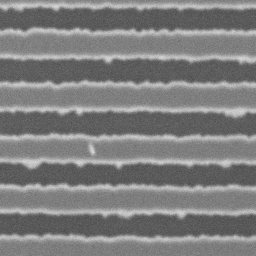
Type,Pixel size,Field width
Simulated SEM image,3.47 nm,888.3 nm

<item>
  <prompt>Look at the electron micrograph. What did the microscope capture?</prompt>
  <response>lines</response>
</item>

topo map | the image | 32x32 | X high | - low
XXXXXXXXXXXXXXXXXXXXXXXXXXXXXXXX
--------------------------------
--------------------------------
--------------------------------
XXXXXXXXXXXXXXXXXXXXXXXXXXXXXXXX
XXXXXXXXXXXXXXXXXXXXXXXXXXXXXXXX
XXXXXXXXXXXXXXXXXXXXXXXXXXXXXXXX
--------------------------------
--------------------------------
--------------------------------
XXXXXXX-XXXXXXXXX-XXXXXXXXXXXXXX
XXXXXXXXXXXXXXXXXXXXXXXXXXXXXXXX
XXXXXXXXXXXXXXXXXXXXXXXXXXXXXXXX
XXXXXXXXXXXXXXXXXXXXXXXXXXXXXXXX
--------------------------------
--------------------------------
--------------------------------
XXXXXXXXXXXXXXXXXXXXXXXXXXXXXXXX
XXXXXXXXXXXXXXXXXXXXXXXXXXXXXXXX
XXXXXXXXXXXXXXXXXXXXXXXXXXXXXXXX
-------------XXX---------X-X---X
--------------------------------
--------------------------------
XXXXXXXXXXXXXXXXXXXXXXXXXXXXXXXX
XXXXXXXXXXXXXXXXXXXXXXXXXXXXXXXX
XXXXXXXXXXXXXXXXXXXXXXXXXXXXXXXX
XXXXXXXXXXXXXXXXXXXXXXXXXXXXXXXX
--------------------------------
--------------------------------
XX-X-XXXXX----------------------
XXXXXXXXXXXXXXXXXXXXXXXXXXXXXXXX
XXXXXXXXXXXXXXXXXXXXXXXXXXXXXXXX